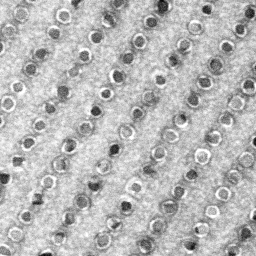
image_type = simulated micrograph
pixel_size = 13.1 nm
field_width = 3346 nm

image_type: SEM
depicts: a regular array of raised bodies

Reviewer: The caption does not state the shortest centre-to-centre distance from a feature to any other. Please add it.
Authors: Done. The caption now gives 20.6 pixels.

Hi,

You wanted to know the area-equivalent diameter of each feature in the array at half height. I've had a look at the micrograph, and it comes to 170 nanometers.